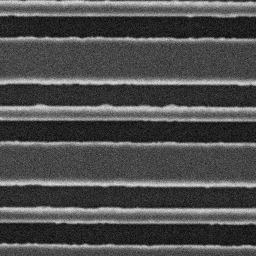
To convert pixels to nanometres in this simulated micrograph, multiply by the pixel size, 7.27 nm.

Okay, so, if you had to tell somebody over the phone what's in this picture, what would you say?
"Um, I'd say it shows lines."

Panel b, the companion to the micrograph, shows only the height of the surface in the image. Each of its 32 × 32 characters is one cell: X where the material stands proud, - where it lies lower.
XXXXXXXXXXXXXXXXXXXXXXXXXXXXXXXX
XXXXXXXXXXXXXXXXXXXXXXXXXXXXXXXX
--------------------------------
--------------------------------
--------------------------------
XXXXXXXXXXXXXXXXXXXXXXXXXXXXXXXX
XXXXXXXXXXXXXXXXXXXXXXXXXXXXXXXX
XXXXXXXXXXXXXXXXXXXXXXXXXXXXXXXX
XXXXXXXXXXXXXXXXXXXXXXXXXXXXXXXX
XXXXXXXXXXXXXXXXXXXXXXXXXXXXXXXX
------------------------XX---XXX
--------------------------------
--------------------------------
XXXXXXXXXXXXXXXXXXXXXXXXXXXXXXX-
XXXXXXXXXXXXXXXXXXXXXXXXXXXXXXXX
--------------------------------
--------------------------------
--------------------------------
XXXXXXXXXXXXXXXXXXXXXXXXXXXXXXXX
XXXXXXXXXXXXXXXXXXXXXXXXXXXXXXXX
XXXXXXXXXXXXXXXXXXXXXXXXXXXXXXXX
XXXXXXXXXXXXXXXXXXXXXXXXXXXXXXXX
XXXXXXXXXXXXXXXXXXXXXXXXXXXXXXXX
--------------------------------
--------------------------------
--------------------------------
XXXXXXXXXXXXXXXXXXXXXXXXXXXXXXXX
XXXXXXXXXXXXXXXXXXXXXXXXXXXXXXXX
--------------------------------
--------------------------------
XXXXX---------------------------
XXXXXXXXXXXXXXXXXXXXXXXXXXXXXXXX